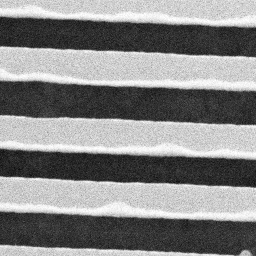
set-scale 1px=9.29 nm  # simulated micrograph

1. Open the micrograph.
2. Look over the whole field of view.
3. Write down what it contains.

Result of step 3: lines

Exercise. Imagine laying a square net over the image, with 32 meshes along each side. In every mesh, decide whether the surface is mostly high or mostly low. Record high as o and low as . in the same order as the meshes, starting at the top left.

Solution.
oooooooooooooooooooooooooooooooo
oooooooooooooooooooooooooooooooo
.............o..oooooooooooooooo
................................
................................
................................
ooooooooooooooo.................
oooooooooooooooooooooooooooooooo
oooooooooooooooooooooooooooooooo
oooooooooooooooooooooooooooooooo
..........oooooooooooooooooooooo
................................
................................
................................
................................
ooooooooooooooooooooooooo.......
oooooooooooooooooooooooooooooooo
oooooooooooooooooooooooooooooooo
.ooooooooooooooooooooooooooooooo
............................oooo
................................
................................
oooooooo........................
oooooooooooooooooooooooooooooooo
oooooooooooooooooooooooooooooooo
oooooooooooooooooooooooooooooooo
......oooooooooooooooooooooooooo
................................
................................
................................
................................
oooooooooooooooooo..............